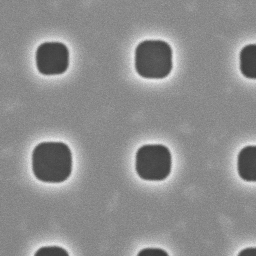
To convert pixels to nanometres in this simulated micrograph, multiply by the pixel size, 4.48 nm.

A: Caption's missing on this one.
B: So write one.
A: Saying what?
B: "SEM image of holes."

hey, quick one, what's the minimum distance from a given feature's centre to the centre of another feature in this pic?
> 454 nanometres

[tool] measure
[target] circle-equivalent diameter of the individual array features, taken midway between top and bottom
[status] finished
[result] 181 nanometres